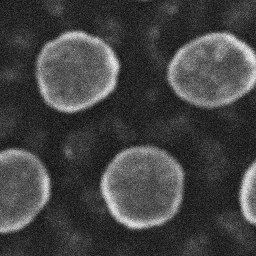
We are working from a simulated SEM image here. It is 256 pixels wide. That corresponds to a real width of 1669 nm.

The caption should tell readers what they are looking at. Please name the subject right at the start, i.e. raised bodies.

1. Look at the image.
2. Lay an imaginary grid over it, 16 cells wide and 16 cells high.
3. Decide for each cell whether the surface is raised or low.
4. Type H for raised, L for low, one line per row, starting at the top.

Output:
LLLLLLLLLLLLLLLL
LLLLLLLLLLLLLLLL
LLLLHHLLLLLLHHHL
LLLHHHHLLLLHHHHH
LLHHHHHLLLLHHHHH
LLLHHHHLLLLHHHHL
LLLHHHLLLLLLHHLL
LLLLLLLLLLLLLLLL
LLLLLLLLLLLLLLLL
LHLLLLLLHHLLLLLL
HHHLLLLHHHHLLLLL
HHHLLLLHHHHLLLLH
HHHLLLLHHHHLLLLH
HHLLLLLHHHHLLLLL
LLLLLLLLLLLLLLLL
LLLLLLLLLLLLLLLL